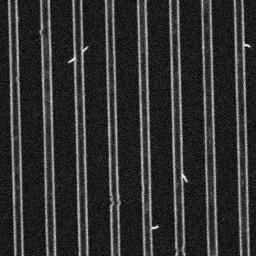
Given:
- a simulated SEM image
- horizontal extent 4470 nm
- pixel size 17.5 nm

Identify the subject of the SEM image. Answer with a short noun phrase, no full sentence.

parallel lines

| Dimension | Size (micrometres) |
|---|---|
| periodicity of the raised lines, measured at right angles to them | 0.563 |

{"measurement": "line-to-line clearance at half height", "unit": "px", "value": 24.9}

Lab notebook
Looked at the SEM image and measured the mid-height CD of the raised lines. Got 140 nm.